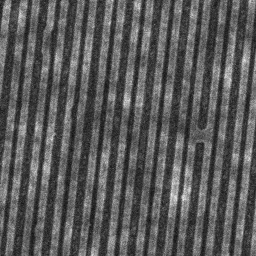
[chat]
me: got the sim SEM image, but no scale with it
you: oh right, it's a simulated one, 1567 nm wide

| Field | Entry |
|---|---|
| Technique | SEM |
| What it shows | parallel lines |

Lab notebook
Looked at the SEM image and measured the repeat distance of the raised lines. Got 86.9 nm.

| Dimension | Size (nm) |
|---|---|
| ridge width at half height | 41.8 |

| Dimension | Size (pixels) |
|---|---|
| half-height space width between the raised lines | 7.7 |